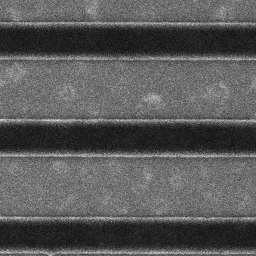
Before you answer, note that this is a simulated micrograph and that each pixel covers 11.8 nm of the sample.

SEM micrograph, one or a few lines or trenches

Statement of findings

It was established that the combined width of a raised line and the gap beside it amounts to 97.3 pixels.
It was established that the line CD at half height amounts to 434 nanometres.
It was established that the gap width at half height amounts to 713 nm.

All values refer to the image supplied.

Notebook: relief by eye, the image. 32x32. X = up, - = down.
--------------------------------
--------------------------------
--------------------------------
XXXXXXXXXXXXXXXXXXXXXXXXXXXXXXXX
XXXXXXXXXXXXXXXXXXXXXXXXXXXXXXXX
XXXXXXXXXXXXXXXXXXXXXXXXXXXXXXXX
XXXXXXXXXXXXXXXXXXXXXXXXXXXXXXXX
--------------------------------
--------------------------------
--------------------------------
--------------------------------
--------------------------------
--------------------------------
--------------------------------
--------------------------------
XXXXXXXXXXXXXXXXXXXXXXXXXXXXXXXX
XXXXXXXXXXXXXXXXXXXXXXXXXXXXXXXX
XXXXXXXXXXXXXXXXXXXXXXXXXXXXXXXX
XXXXXXXXXXXXXXXXXXXXXXXXXXXXXXXX
-------XXXXXXXXXXXXXXXXXXXXXXXXX
--------------------------------
--------------------------------
--------------------------------
--------------------------------
--------------------------------
--------------------------------
--------------------------------
XXXXXXXXXXXXXXXXXXXXXXXXXXXXXXXX
XXXXXXXXXXXXXXXXXXXXXXXXXXXXXXXX
XXXXXXXXXXXXXXXXXXXXXXXXXXXXXXXX
XXXXXXXXXXXXXXXXXXXXXXXXXXXXXXXX
XXXXXXXXXXXXXXXXXXXXXXXXXXXXXXXX